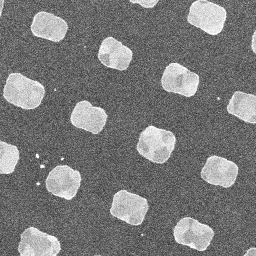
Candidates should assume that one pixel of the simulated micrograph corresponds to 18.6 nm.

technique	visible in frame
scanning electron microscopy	a regular array of raised bodies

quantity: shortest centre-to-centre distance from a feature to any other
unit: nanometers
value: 1270